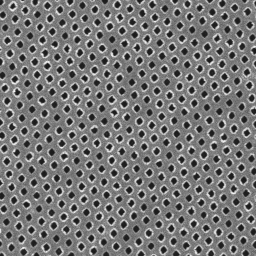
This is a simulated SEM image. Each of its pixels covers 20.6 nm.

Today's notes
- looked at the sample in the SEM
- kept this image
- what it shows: a regular array of holes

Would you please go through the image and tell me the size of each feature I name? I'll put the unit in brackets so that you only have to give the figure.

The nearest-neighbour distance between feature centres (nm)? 265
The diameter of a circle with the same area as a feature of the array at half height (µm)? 0.136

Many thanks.